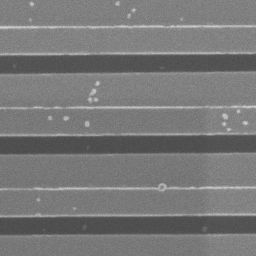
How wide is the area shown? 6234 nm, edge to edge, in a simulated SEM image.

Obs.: lines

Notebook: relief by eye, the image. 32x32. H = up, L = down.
HHHHHHHHHHHHHHHHHHHHHHHHHHHHHHHH
HHHHHHHHHHHHHHHHHHHHHHHHHHHHHHHH
HHHHHHHHHHHHHHHHHHHHHHHHHHHHHHHH
HHHHHHHHHHHHHHHHHHHHHHHHHHHHHHHH
HHHHHHHHHHHHHHHHHHHHHHHHHHHHHHHH
HHHHHHHHHHHHHHHHHHHHHHHHHHHHHHHH
HHHHHHHHHHHHHHHHHHHHHHHHHHHHHHHH
LLLLLLLLLLLLLLLLLLLLLLLLLLLLLLLL
LLLLLLLLLLLLLLLLLLLLLLLLLLLLLLLL
HHHHHHHHHHHHHHHHHHHHHHHHHHHHHHHH
HHHHHHHHHHHHHHHHHHHHHHHHHHHHHHHH
HHHHHHHHHHHHHHHHHHHHHHHHHHHHHHHH
HHHHHHHHHHHHHHHHHHHHHHHHHHHHHHHH
HHHHHHHHHHHHHHHHHHHHHHHHHHHHHHHH
HHHHHHHHHHHHHHHHHHHHHHHHHHHHHHHH
HHHHHHHHHHHHHHHHHHHHHHHHHHHHHHHH
HHHHHHHHHHHHHHHHHHHHHHHHHHHHHHHH
LLLLLLLLLLLLLLLLLLLLLLLLLLLLLLLL
LLLLLLLLLLLLLLLLLLLLLLLLLLLLLLLL
HHHHHHHHHHHHHHHHHHHHHHHHHHHHHHHH
HHHHHHHHHHHHHHHHHHHHHHHHHHHHHHHH
HHHHHHHHHHHHHHHHHHHHHHHHHHHHHHHH
HHHHHHHHHHHHHHHHHHHHHHHHHHHHHHHH
HHHHHHHHHHHHHHHHHHHHHHHHHHHHHHHH
HHHHHHHHHHHHHHHHHHHHHHHHHHHHHHHH
HHHHHHHHHHHHHHHHHHHHHHHHHHHHHHHH
HHHHHHHHHHHHHHHHHHHHHHHHHHHHHHHH
LLLLLLLLLLLLLLLLLLLLLLLLLLLLLLLL
LLLLLLLLLLLLLLLLLLLLLLLLLLLLLLLL
LLLLHHHHHHHHHHHHHHHHHHHHHHHHHHHH
HHHHHHHHHHHHHHHHHHHHHHHHHHHHHHHH
HHHHHHHHHHHHHHHHHHHHHHHHHHHHHHHH